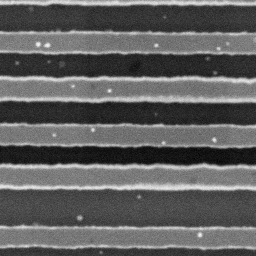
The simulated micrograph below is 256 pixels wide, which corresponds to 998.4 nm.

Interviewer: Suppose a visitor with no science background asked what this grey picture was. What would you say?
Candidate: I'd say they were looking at lines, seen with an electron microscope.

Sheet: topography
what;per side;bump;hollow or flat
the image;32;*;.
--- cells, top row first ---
**.***..************************
................................
................................
................................
********************************
********************************
..******************************
................................
................................
................................
********************************
********************************
********************************
................................
................................
................................
********************************
********************************
................................
................................
.........................*......
********************************
********************************
.************.******************
................................
................................
................................
................................
*****************.*****...**.*.*
********************************
********************************
................................